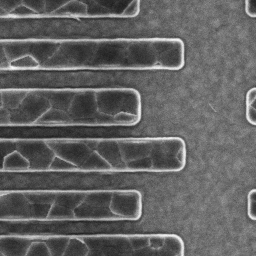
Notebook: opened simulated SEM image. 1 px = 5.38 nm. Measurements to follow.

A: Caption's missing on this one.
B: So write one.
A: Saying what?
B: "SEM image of parallel lines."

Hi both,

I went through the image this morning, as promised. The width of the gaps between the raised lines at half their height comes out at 19.3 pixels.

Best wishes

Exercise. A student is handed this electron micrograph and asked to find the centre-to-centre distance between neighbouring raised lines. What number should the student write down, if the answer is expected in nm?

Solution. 270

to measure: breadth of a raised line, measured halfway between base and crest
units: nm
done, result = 164